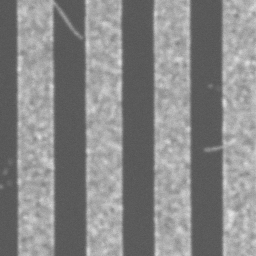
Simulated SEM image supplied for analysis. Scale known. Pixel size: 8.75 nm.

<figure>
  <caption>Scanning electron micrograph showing wiring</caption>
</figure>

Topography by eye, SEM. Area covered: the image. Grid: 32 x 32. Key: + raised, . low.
..+++++....++++....+++++....++++
..+++++....++++....+++++....++++
..+++++....++++....+++++....++++
..+++++....++++....+++++....++++
..+++++....++++....+++++....++++
..+++++....++++....+++++....++++
..+++++....++++....+++++....++++
..+++++....++++....+++++....++++
..+++++....++++....+++++....++++
..+++++....++++....+++++....++++
..+++++....++++....+++++....++++
..+++++....++++....+++++....++++
..+++++....++++....+++++....++++
..+++++....++++....+++++....++++
..+++++....++++....+++++....++++
..+++++....++++....+++++....++++
..+++++....++++....+++++....++++
..+++++....++++....+++++....++++
..+++++....++++....+++++....++++
..+++++....++++....+++++....++++
..+++++....++++....+++++....++++
..+++++....++++....+++++....++++
..+++++....++++....+++++....++++
..+++++....++++....+++++....++++
..+++++....++++....+++++....++++
..+++++....++++....+++++....++++
..+++++....++++....+++++....++++
..+++++....++++....+++++....++++
..+++++....++++.....++++....++++
..+++++....++++.....++++....++++
..+++++....++++.....++++....++++
..+++++....++++.....++++....++++